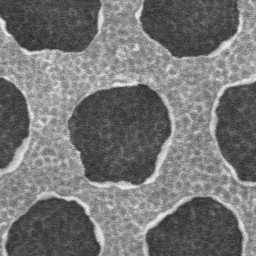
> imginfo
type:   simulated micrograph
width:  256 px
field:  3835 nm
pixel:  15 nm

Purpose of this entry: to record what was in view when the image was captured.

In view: holes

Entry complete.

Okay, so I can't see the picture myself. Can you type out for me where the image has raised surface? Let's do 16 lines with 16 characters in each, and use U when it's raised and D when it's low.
DDDDDDUUUDDDDDDU
DDDDDDUUUDDDDDDU
UDDDDDUUUUDDDDUU
UUUUUUUUUUUDUUUU
UUUUUUUUUUUUUUUU
DUUUUUUDDUUUUUDD
DDUUUDDDDDUUUUDD
DDUUDDDDDDDUUDDD
DDUUDDDDDDDUUDDD
DUUUUDDDDDUUUUDD
DUUUUDDDDDUUUUDD
UUUUUUDDDUUUUUUU
UUDDUUUUUUUUDDUU
UDDDDDUUUUDDDDDU
DDDDDDUUUDDDDDDU
DDDDDDUUUDDDDDDU